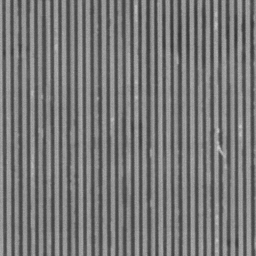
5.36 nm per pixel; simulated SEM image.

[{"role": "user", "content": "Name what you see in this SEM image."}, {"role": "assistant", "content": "parallel lines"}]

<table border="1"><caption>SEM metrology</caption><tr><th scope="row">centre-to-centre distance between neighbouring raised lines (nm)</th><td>42.8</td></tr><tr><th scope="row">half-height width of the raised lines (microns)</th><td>0.0168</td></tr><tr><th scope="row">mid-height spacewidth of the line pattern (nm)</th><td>24.8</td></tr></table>